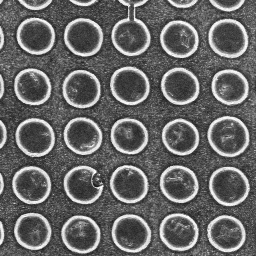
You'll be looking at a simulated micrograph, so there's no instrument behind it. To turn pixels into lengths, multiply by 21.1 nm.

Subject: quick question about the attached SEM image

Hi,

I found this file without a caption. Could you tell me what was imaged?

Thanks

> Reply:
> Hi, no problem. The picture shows a regular array of raised bodies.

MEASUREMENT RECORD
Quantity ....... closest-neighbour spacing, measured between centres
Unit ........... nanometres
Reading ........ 1000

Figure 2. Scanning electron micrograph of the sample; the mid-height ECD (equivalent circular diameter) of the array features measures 730 nm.